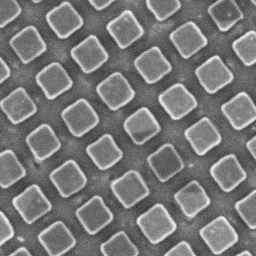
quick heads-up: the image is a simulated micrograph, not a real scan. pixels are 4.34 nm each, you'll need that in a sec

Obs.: a regular array of raised bodies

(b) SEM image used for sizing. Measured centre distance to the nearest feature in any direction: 43.6 pixels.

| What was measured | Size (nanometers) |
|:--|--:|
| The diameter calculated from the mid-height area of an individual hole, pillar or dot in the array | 140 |